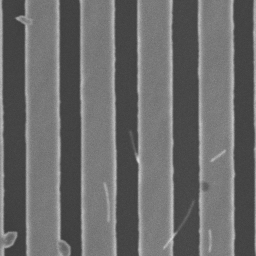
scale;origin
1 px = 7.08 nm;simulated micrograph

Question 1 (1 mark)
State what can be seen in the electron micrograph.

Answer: lines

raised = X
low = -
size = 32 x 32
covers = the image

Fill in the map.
---XXXX---XXXX---XXXXX---XXXX---
---XXXX---XXXX---XXXXX---XXXX---
--XXXXX---XXXX---XXXXX---XXXX---
---XXXX---XXXX---XXXX----XXXX---
---XXXX---XXXX---XXXX----XXXX---
---XXXX---XXXX---XXXXX---XXXX---
---XXXX---XXXX---XXXXX---XXXX---
---XXXX---XXXX---XXXXX---XXXX---
---XXXX---XXXX---XXXXX---XXXX---
---XXXX---XXXX---XXXXX---XXXX---
---XXXX---XXXX---XXXXX---XXXX---
---XXXX---XXXX---XXXXX---XXXX---
---XXXX---XXXX---XXXXX---XXXX---
---XXXX---XXXX---XXXXX---XXXX---
---XXXX---XXXX---XXXXX---XXXX---
---XXXX---XXXX---XXXXX---XXXX---
---XXXX---XXXX---XXXXX---XXXX---
---XXXX---XXXX---XXXXX---XXXX---
---XXXX---XXXXX--XXXXX---XXXX---
---XXXX---XXXXX--XXXXX---XXXX---
---XXXX---XXXXX--XXXXX---XXXX---
---XXXX---XXXXX--XXXXX---XXXX---
---XXXX---XXXXX--XXXXX---XXXX---
---XXXX---XXXXX--XXXXX---XXXX---
---XXXX---XXXXX--XXXXX---XXXX---
---XXXX---XXXXX--XXXXX---XXXX---
---XXXX---XXXXX--XXXXX---XXXX---
---XXXX---XXXXX--XXXXX---XXXX---
---XXXX---XXXX---XXXXX---XXXX---
XX-XXXX---XXXXX--XXXXX---XXXX---
XX-XXXXX--XXXXX--XXXXX---XXXX---
---XXXXXX-XXXXX--XXXXX---XXXX---